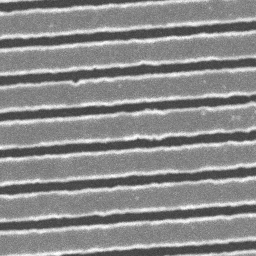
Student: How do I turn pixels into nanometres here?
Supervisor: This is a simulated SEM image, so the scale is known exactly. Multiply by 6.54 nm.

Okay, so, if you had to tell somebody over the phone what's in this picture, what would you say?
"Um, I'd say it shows parallel lines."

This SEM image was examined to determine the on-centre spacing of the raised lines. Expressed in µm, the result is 0.238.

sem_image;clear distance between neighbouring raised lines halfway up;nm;70.8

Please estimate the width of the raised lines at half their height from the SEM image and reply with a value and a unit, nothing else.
170 nm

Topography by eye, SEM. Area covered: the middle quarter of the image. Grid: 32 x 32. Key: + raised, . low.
++++++++++++.++.................
++..............................
...........................+++++
..............++++++++++++++++++
.+..++++++++++++++++++++++++++++
++++++++++++++++++++++++++++++++
++++++++++++++++++++++++++++++++
++++++++++++++++++++++++++++++++
++++++++++++++++++++++++++++++..
+++++++++++++++.++..............
++++............................
............................+.++
.............+++++++++++++++++++
...+++++++++++++++++++++++++++++
++++++++++++++++++++++++++++++++
++++++++++++++++++++++++++++++++
++++++++++++++++++++++++++++++++
++++++++++++++++++++++++++++++++
++++++++++++++++++..++.+........
++++.+..........................
...............................+
.................+++++++++++++++
..++++++++++++++++++++++++++++++
++++++++++++++++++++++++++++++++
++++++++++++++++++++++++++++++++
++++++++++++++++++++++++++++++++
++++++++++++++++++++++++++++++++
++++++++++++++++++.++...........
+++++++++.......................
................................
....................++++++++++++
.....+++++++++++++++++++++++++++